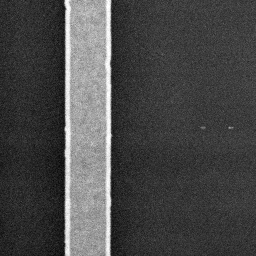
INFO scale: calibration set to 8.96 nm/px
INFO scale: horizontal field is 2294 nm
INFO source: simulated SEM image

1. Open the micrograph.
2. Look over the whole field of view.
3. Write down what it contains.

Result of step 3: one or a few lines or trenches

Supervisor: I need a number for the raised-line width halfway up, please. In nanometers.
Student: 367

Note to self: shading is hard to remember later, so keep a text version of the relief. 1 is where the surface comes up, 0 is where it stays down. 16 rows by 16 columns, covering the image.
0000111000000000
0000111000000000
0000111000000000
0000111000000000
0000111000000000
0000111000000000
0000111000000000
0000111000000000
0000111000000000
0000111000000000
0000111000000000
0000111000000000
0000111000000000
0000111000000000
0000111000000000
0000111000000000